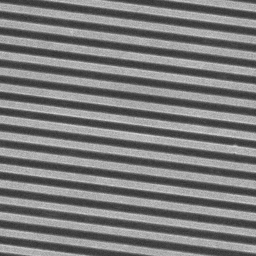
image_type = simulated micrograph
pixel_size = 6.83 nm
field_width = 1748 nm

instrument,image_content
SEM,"parallel lines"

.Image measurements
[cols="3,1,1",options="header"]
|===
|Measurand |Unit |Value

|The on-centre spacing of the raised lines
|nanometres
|109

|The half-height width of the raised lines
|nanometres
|59.3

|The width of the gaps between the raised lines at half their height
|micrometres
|0.0534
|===